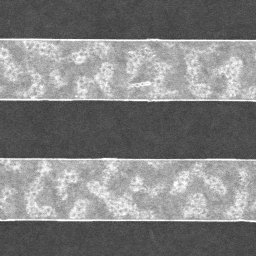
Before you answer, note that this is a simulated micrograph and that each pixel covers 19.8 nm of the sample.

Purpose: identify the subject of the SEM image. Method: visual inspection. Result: one or a few lines or trenches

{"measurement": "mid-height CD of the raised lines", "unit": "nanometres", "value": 1220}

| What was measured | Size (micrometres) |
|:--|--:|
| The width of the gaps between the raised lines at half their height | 1.17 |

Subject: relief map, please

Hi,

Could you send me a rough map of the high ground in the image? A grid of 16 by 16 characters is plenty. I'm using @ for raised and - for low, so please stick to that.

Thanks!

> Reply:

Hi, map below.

----------------
----------------
@@@@-----@------
@@@@@@@@@@@@@@@@
@@@@@@@@@@@@@@@@
@@@@@@@@@@@@@@@@
----------------
----------------
----------------
----------------
@@@@@@@@@@@@@@@@
@@@@@@@@@@@@@@@@
@@@@@@@@@@@@@@@@
@@@@@@@@@@@@@@@@
----------------
----------------